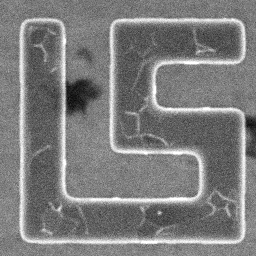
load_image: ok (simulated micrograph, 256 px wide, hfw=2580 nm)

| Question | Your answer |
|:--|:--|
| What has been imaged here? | wiring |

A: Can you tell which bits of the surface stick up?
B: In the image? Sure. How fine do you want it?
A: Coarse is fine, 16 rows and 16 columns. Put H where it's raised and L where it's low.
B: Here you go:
LLLLLLLLLLLLLLLL
LLHHLLLHHHHHHHHL
LHHHLLLHHHHHHHHL
LHHHLLLHHHHHHHHL
LHHHLLLHHHLLLLLL
LHHHLLLHHHLLLLLL
LHHHLLLHHHLLLLLL
LHHHLLLHHHHHHHHL
LHHHLLLHHHHHHHHL
LHHHLLLLLLLLHHHL
LHHHLLLLLLLLLHHL
LHHHLLLLLLLLLHHL
LHHHHLLLLLLLHHHL
LHHHHHHHHHHHHHHL
LLHHHHHHHHHHHHHL
LLLLLLLLLLLLLLLL